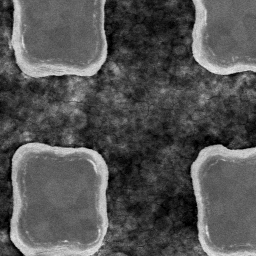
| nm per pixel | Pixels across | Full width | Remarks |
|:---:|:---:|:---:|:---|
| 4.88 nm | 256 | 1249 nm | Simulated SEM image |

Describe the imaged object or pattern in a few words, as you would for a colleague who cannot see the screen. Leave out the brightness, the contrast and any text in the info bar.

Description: raised bodies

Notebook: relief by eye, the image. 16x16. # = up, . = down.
.######.....####
.#####......####
.######.....####
.######.....####
....#...........
................
................
................
................
.#####.......#..
.#####......####
.#####......####
.#####......####
.#####.......###
.#####......####
.#####.......###